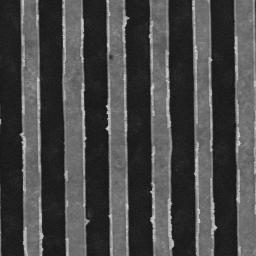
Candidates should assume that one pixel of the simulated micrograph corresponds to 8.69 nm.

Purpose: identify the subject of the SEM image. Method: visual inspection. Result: parallel lines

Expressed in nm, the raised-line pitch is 374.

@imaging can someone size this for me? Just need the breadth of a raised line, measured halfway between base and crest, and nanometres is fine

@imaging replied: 159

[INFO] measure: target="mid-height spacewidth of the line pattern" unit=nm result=214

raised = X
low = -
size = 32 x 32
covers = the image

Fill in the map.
---XX---XX---XXX---XX---XX---XXX
---XX---XX---XXX---XX---XX---XXX
---XX---XX---XXX---XX---XX---XXX
---XX---XX---XXX---XX---XX---XXX
---XX---XX----XX---XX---XX---XXX
---XX---XX---XXX---XX---XX---XXX
---XX---XX----XX---XX---XX---XXX
---XX---XX---XXX---XX---XX---XXX
---XX---XX----XX---XX---XX---XXX
---XX---XX----XX---XX---XX---XXX
---XX---XXX--XXX---XX---XX---XXX
---XX---XXX---XX---XX---XX----XX
---XX---XX----XX---XX---XX----XX
---XX---XXX--XXX---XX---XX----XX
---XX---XXX--XXX---XX---XX----XX
---XX---XXX--XXX---XX---XX----XX
---XX---XXX--XXX---XX---XX----XX
---XX---XXX---XX---XX---XXX---XX
---XX---XXX---XX---XX---XXX---XX
---XX---XXX---XX---XX---XXX---XX
---XX---XXX---XX---XX---XXX---XX
---XX---XXX---XX---XX---XXX---XX
---XX---XXX---XX---XX----X----XX
---XX---XXX---XX---XX----X----XX
---XX---XXX---XX---XX----XX---XX
---XX---XXX---XX---XX----XX---XX
---XX---XXX---XX---XX----XX---XX
---XX---XXX---XX---XX----XX---XX
---XX---XXX---XX---XX----XX---XX
---XX---XXX---XX---XX----XX---XX
---XX---XXX---XX---XXX---XX---XX
---XX---XXX---XX---XX----XX---XX